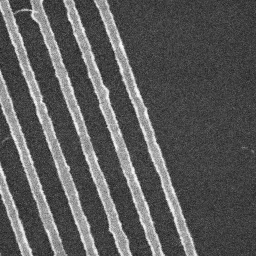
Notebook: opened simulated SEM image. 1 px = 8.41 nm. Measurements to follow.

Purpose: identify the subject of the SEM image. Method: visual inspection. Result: parallel lines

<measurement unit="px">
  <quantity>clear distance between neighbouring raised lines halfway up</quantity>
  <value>21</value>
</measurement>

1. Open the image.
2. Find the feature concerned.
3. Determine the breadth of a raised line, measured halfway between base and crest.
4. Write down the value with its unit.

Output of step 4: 82.2 nm